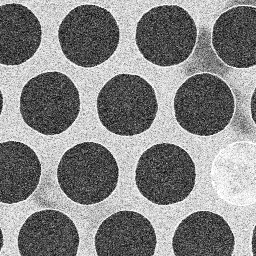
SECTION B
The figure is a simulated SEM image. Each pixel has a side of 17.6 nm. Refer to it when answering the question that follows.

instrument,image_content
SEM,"holes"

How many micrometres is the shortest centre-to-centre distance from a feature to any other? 1.36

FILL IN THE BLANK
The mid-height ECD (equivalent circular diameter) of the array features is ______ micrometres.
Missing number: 1.09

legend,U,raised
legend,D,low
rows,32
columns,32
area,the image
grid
UDUUUUUUUUUUUUUUUUUUUUUUUUUUUUUU
DDDDUUUUUDDDDDUUUUDDDDDUUUUUDDDD
DDDDDUUUDDDDDDUUUDDDDDDDUUUDDDDD
DDDDDUUDDDDDDDDUUDDDDDDDDUUDDDDD
DDDDDUUDDDDDDDDUUDDDDDDDDUDDDDDD
DDDDDUUDDDDDDDDUUDDDDDDDUUDDDDDD
DDDDUUUUDDDDDDUUUUDDDDDDUUUDDDDD
DDDUUUUUUDDDDUUUUUDDDDDUUUUUDDDD
UUUUUUUUUUUUUUUUUUUUUUUUUUUUUUDU
UUUUUDDDUUUUUUDDDUUUUUUUDDDUUUUU
UUUDDDDDDUUUUDDDDDDUUUUDDDDDUUUU
UUUDDDDDDDUUDDDDDDDUUUDDDDDDDUUU
UUDDDDDDDDUUDDDDDDDDUUDDDDDDDUUD
UUDDDDDDDDUUDDDDDDDDUUDDDDDDDUUD
UUUDDDDDDDUUDDDDDDDUUUDDDDDDDUUD
UUUDDDDDDUUUUDDDDDDUUUDDDDDDDUUU
UUUUUDDDUUUUUUDDDDUUUUUUDDDUUUUU
UUUUUUUUUUUUUUUUUUUUUUUUUUUUUUUU
DDDDUUUUUDDDDUUUUUUDDDDUUUUUUUUU
DDDDDUUUDDDDDDUUUUDDDDDDUUUUUUUU
DDDDDUUDDDDDDDDUUDDDDDDDUUUUUUUU
DDDDDUUDDDDDDDDUUDDDDDDDUUUUUUUU
DDDDDUUDDDDDDDDUUDDDDDDDUUUUUUUU
DDDDDUUUDDDDDDUUUDDDDDDDUUUUUUUU
DDDDUUUUDDDDDDUUUUDDDDDUUUUUUUUU
UUUUUUUUUUDDUUUUUUUDDDUUUUUUUUUU
UUUUUDDDUUUUUUUDDUUUUUUUUDUUUUUU
UUUDDDDDDUUUUDDDDDDUUUUDDDDDUUUU
UUUDDDDDDDUUDDDDDDDUUUDDDDDDDUUU
UUDDDDDDDDUUDDDDDDDUUUDDDDDDDUUD
UUDDDDDDDDUUDDDDDDDDUUDDDDDDDUUD
UUDDDDDDDDUUDDDDDDDUUUDDDDDDDUUD